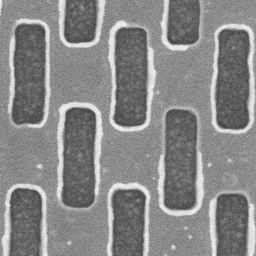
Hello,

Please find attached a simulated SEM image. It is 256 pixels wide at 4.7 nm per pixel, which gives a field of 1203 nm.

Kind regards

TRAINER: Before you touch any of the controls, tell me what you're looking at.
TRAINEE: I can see holes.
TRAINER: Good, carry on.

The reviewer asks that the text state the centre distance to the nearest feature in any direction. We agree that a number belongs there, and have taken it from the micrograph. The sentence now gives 454 nm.